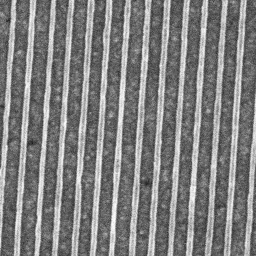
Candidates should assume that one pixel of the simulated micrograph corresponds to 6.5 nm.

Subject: parallel lines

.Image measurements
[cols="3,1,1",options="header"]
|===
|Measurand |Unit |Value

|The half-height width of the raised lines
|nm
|30.8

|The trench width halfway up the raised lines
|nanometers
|94.1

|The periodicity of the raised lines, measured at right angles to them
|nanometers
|124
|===